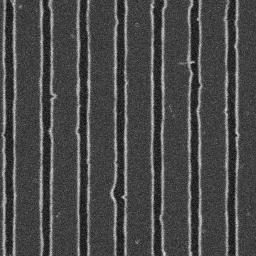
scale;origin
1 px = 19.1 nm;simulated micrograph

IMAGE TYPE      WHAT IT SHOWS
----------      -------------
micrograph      parallel lines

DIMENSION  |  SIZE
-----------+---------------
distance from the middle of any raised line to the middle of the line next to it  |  707 nm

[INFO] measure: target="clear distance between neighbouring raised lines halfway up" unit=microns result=0.179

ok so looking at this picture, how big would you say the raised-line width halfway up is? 522 nanometers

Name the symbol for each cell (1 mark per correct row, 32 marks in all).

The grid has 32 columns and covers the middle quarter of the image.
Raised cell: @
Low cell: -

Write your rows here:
@@@@--@@@@@@@--@@@@@@@---@@@@@@-
@@@@--@@@@@@@--@@@@@@@---@@@@@@@
@@@@--@@@@@@@--@@@@@@@---@@@@@@@
@@@@--@@@@@@@--@@@@@@@---@@@@@@@
@@@@--@@@@@@@---@@@@@@---@@@@@@@
@@@@--@@@@@@@---@@@@@@---@@@@@@@
@@@@--@@@@@@@--@@@@@@@---@@@@@@-
@@@@--@@@@@@@--@@@@@@@---@@@@@@-
@@@@--@@@@@@@---@@@@@@---@@@@@@-
@@@@--@@@@@@@---@@@@@@---@@@@@@-
@@@@--@@@@@@@--@@@@@@@---@@@@@@-
@@@@--@@@@@@@---@@@@@@---@@@@@@-
@@@@--@@@@@@@---@@@@@@---@@@@@@-
@@@@--@@@@@@@---@@@@@@---@@@@@@-
@@@@--@@@@@@@---@@@@@@---@@@@@@-
@@@@--@@@@@@@---@@@@@@---@@@@@@-
@@@---@@@@@@@--@@@@@@@---@@@@@@-
@@@@--@@@@@@@--@@@@@@@---@@@@@@-
@@@@--@@@@@@@--@@@@@@@---@@@@@@-
@@@@--@@@@@@@--@@@@@@@---@@@@@@-
@@@@--@@@@@@@--@@@@@@@---@@@@@@-
@@@@--@@@@@@@--@@@@@@@---@@@@@@-
@@@@--@@@@@@@---@@@@@@---@@@@@@-
@@@@--@@@@@@@---@@@@@@---@@@@@@-
@@@@--@@@@@@@---@@@@@@---@@@@@@-
@@@@--@@@@@@@---@@@@@@---@@@@@@-
@@@@--@@@@@@@---@@@@@@---@@@@@@@
@@@@--@@@@@@@---@@@@@@---@@@@@@@
@@@@--@@@@@@@---@@@@@@---@@@@@@@
@@@@--@@@@@@@---@@@@@@---@@@@@@-
@@@@--@@@@@@@---@@@@@@---@@@@@@-
@@@@--@@@@@@----@@@@@@---@@@@@@-